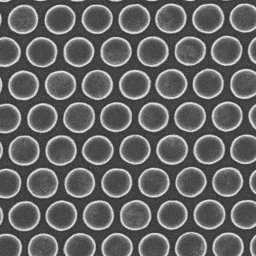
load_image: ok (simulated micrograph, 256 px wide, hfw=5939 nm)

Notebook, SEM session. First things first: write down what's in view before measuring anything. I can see a regular array of raised bodies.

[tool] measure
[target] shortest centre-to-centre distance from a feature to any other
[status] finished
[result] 0.854 um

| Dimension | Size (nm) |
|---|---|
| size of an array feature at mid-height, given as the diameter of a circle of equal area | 675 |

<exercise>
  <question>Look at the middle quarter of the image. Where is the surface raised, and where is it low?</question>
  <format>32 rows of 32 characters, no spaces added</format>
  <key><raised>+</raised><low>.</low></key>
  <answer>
...+........++..................
..........................++....
++....+++++....+++++....+++++...
++...+++++++...++++++..+++++++..
+++..+++++++..++++++++.++++++++.
+++..+++++++..+++++++..++++++++.
+++..+++++++..+++++++..+++++++..
++...++++++....+++++....+++++...
+......+++.......++.......++....
................................
..++++.....++++.....+++++....+++
.++++++...++++++...+++++++..++++
+++++++..++++++++..+++++++..++++
+++++++..++++++++..+++++++..++++
+++++++..+++++++...+++++++..++++
.++++++...++++++....+++++....+++
..++++.....++++......+++......++
................................
+......+++......++++.....++++...
++....+++++....++++++...++++++..
+++..+++++++..+++++++...+++++++.
+++..+++++++..+++++++..++++++++.
+++..+++++++..+++++++...+++++++.
++...+++++++...++++++...++++++..
+......++++.....++++.....++++...
................................
..++++......++.......+++......++
.++++++....+++++....++++++...+++
.++++++...+++++++..+++++++..++++
.++++++...+++++++..+++++++..++++
.++++++...+++++++..+++++++..++++
.++++++...++++++...+++++++...+++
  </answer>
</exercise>